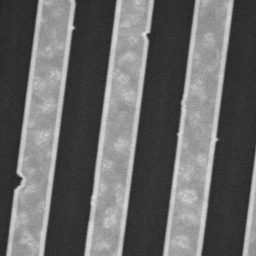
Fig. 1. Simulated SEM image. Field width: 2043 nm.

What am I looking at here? one or a few lines or trenches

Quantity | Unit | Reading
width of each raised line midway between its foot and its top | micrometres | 0.263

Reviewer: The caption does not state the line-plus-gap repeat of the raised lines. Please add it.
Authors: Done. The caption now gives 622 nm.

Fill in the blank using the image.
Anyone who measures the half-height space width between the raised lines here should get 0.36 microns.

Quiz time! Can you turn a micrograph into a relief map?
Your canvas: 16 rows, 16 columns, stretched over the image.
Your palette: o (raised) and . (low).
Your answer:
...oo..oo...oo..
..oo...oo...oo..
..oo...oo...oo..
..oo...oo...oo..
..oo...oo...oo..
..oo...oo...oo..
..oo...oo..ooo..
..oo..ooo..oo...
.ooo..oo...oo...
.oo...oo...oo...
.oo...oo...oo...
.oo...oo...oo...
.oo...oo...oo...
.oo...oo...oo...
.oo...oo...oo...
.oo..ooo..oo...o